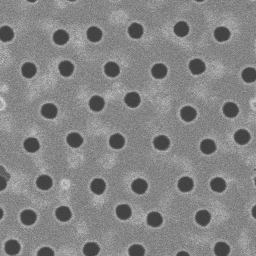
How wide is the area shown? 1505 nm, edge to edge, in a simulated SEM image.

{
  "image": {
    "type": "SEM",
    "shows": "a regular array of holes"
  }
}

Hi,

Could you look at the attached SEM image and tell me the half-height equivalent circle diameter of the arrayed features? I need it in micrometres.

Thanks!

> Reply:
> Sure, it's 0.0942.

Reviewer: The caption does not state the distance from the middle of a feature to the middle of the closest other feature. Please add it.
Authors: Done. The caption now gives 213 nanometers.